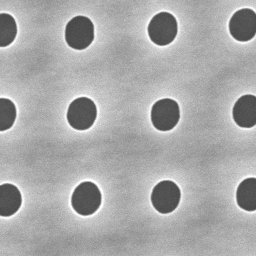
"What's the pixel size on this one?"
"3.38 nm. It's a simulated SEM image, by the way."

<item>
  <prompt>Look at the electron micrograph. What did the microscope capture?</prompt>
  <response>holes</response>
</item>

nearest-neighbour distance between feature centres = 0.275 um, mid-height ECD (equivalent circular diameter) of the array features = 109 nm